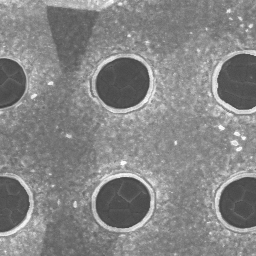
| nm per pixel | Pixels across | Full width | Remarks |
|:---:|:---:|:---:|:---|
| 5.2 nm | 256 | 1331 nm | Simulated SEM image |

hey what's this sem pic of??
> holes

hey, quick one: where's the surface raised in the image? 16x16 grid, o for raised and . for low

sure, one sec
oooooooooooooooo
oooooooooooooooo
oooooooooooooooo
ooooooooooooooo.
.ooooo...ooooo..
..oooo...ooooo..
.oooooo..ooooo..
oooooooooooooooo
oooooooooooooooo
oooooooooooooooo
oooooooooooooooo
.oooooo..ooooo..
..oooo...ooooo..
..oooo...ooooo..
oooooooooooooooo
oooooooooooooooo